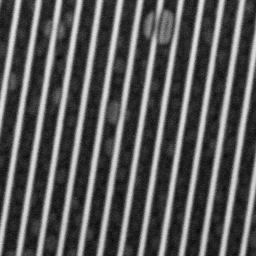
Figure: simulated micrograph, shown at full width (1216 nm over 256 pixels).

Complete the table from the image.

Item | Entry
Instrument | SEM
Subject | parallel lines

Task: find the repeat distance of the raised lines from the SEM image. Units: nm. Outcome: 95.4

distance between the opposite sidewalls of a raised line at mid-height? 22.2 nm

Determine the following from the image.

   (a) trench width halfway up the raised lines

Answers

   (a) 72.6 nm